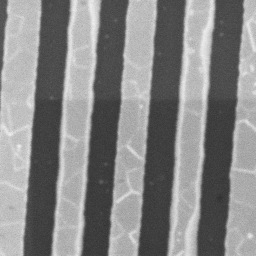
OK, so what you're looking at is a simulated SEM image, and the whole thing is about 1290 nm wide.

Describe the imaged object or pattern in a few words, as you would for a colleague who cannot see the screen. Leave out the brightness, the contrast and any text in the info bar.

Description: lines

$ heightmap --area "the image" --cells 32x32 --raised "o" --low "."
.oooo....ooo....ooo....oooo....o
.oooo....ooo....ooo....oooo....o
.oooo....ooo....ooo....oooo....o
.oooo....ooo....ooo....ooo....oo
.oooo....ooo....ooo....ooo....oo
.oooo....ooo....ooo....ooo....oo
.oooo....ooo....ooo....ooo....oo
ooooo....ooo....ooo....ooo....oo
ooooo...oooo....ooo....ooo....oo
oooo....oooo...oooo....ooo....oo
oooo....oooo...oooo....ooo....oo
oooo....ooo....oooo....ooo....oo
oooo....ooo....oooo....ooo....oo
oooo....ooo....oooo....ooo....oo
oooo....ooo....oooo...oooo....oo
oooo....ooo....ooo....oooo...ooo
oooo....ooo....ooo....oooo...ooo
oooo....ooo....ooo....ooo....ooo
oooo....ooo....ooo....ooo....ooo
oooo....ooo....ooo....ooo....ooo
oooo....ooo...oooo....ooo....ooo
oooo....ooo...oooo....ooo....ooo
oooo...oooo...oooo....ooo....ooo
ooo....oooo...oooo....ooo....ooo
ooo....ooo....oooo....ooo....ooo
ooo....ooo....oooo....ooo....ooo
ooo....ooo....oooo....ooo....ooo
ooo....ooo....oooo....oo.....ooo
ooo....ooo....ooo....ooo....oooo
ooo....ooo....ooo....ooo....oooo
ooo....ooo....ooo....ooo....oooo
ooo....ooo....ooo....ooo....oooo